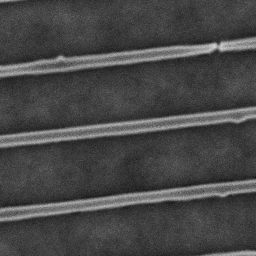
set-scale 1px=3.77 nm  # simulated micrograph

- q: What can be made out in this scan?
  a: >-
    one or a few lines or trenches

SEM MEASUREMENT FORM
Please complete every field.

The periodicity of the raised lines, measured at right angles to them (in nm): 267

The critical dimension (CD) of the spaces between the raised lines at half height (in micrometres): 0.228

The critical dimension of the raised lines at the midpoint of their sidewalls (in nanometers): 38.3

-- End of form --